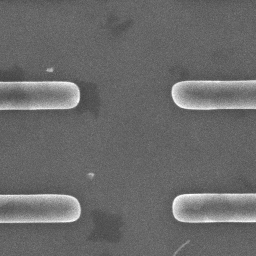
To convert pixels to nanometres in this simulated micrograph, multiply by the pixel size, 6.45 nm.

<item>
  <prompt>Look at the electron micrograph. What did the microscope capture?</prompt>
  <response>wiring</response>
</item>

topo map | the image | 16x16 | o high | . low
................
................
................
................
................
ooooo......ooooo
ooooo......ooooo
................
................
................
................
................
ooooo......ooooo
ooooo......ooooo
................
................